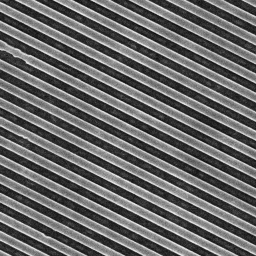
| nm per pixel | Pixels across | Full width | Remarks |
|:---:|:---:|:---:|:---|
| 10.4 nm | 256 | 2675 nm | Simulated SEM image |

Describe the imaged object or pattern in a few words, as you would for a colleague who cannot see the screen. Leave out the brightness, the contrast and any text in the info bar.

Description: parallel lines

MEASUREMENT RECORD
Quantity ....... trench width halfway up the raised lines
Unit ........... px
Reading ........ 8.59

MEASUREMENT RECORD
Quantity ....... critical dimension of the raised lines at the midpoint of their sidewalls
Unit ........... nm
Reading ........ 89.8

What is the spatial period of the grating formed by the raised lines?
17 pixels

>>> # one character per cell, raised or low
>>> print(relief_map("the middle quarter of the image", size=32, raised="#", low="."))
..####.....#####.....####.....##
....####.....#####.....####.....
#.....####.....#####.....####...
###.....####.....#####.....####.
#####....#####.....####......###
..#####.....####.....####......#
....#####....#####.....####.....
#.....#####....#####.....####...
###.....#####.....####.....####.
.####.....#####.....####.....###
...####.....#####.....####.....#
.....####.....#####....#####....
##.....####.....#####.....####..
####.....####.....#####....#####
.#####.....####.....#####.....##
...#####.....####.....#####....#
.....#####.....####.....#####...
##.....####......####.....#####.
####.....####.....#####.....####
.#####.....####.....#####.....##
...#####.....####.....#####.....
#....#####.....####.....#####...
##.....#####.....####.....#####.
####.....#####.....####.....####
..####.....#####.....####.....##
....####.....#####.....####.....
#.....####.....#####.....####...
###.....####.....#####.....####.
.####.....####.....#####.....###
...####.....####.....#####.....#
.....####.....####.....#####....
#.....#####.....####.....#####..